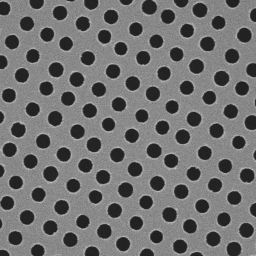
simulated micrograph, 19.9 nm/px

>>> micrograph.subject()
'a regular array of holes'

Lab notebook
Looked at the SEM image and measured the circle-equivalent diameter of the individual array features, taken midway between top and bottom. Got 14.3 pixels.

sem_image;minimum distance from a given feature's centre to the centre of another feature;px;22.8